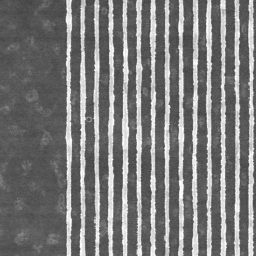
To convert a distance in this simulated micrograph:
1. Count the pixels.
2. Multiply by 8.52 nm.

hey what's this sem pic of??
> parallel lines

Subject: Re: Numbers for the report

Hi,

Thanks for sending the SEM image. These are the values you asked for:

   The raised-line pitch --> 119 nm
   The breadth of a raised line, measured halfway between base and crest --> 27.7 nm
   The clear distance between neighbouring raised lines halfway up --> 89.5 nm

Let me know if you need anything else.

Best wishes